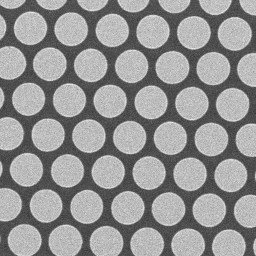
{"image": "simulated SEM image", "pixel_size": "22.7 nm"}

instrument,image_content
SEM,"an array of small figures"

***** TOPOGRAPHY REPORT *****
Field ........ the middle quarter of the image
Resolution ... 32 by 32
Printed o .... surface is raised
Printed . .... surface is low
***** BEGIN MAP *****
...oooooooo..oooooooo..oooooooo.
...ooooooo...oooooooo..oooooooo.
...ooooooo...ooooooo....ooooooo.
....ooooo.....oooooo....oooooo..
.........................oooo...
ooo.......o.....................
oooo.....ooooo.....ooooo......oo
ooooo...ooooooo...ooooooo....ooo
ooooo...ooooooo...oooooooo..oooo
ooooo...ooooooo...oooooooo..oooo
ooooo...ooooooo...oooooooo..oooo
ooooo...ooooooo...ooooooo...oooo
ooo......ooooo.....oooooo....ooo
.....................oo.......oo
....oooo.......oo...............
...ooooooo....ooooo.....ooooo...
..oooooooo...ooooooo...ooooooo..
..oooooooo...ooooooo...oooooooo.
..oooooooo...ooooooo...oooooooo.
...ooooooo...ooooooo...ooooooo..
...oooooo....ooooooo...ooooooo..
....oooo......ooooo.....ooooo...
................................
ooo......oooo.......ooo.........
oooo....oooooo....oooooo.....ooo
ooooo..oooooooo...ooooooo...oooo
ooooo..oooooooo..oooooooo...oooo
ooooo..oooooooo..oooooooo...oooo
oooo...oooooooo...ooooooo...oooo
oooo....oooooo....ooooooo...oooo
oo.......oooo......oooo......ooo
...............................o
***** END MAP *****